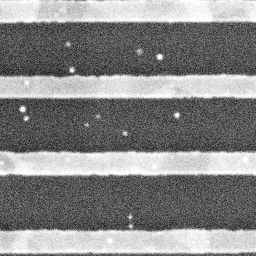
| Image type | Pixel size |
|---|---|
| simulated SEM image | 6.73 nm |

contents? lines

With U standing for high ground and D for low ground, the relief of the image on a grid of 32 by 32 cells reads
UUUUUUUUUUUUUUUUUUUUUUUUUUUUUUUU
UUUUUUUUUUUUUUUUUUUUUUUUUUUUUUUU
UUUUUUUUUUUUUUUUUDUUUUUDUUUUUDDU
DDDDDDDDDDDDDDDDDDDDDDDDDDDDDDDD
DDDDDDDDDDDDDDDDDDDDDDDDDDDDDDDD
DDDDDDDDDDDDDDDDDDDDDDDDDDDDDDDD
DDDDDDDDDDDDDDDDDDDDDDDDDDDDDDDD
DDDDDDDDDDDDDDDDDDDDDDDDDDDDDDDD
DDDDDDDDDDDDDDDDDDDDDDDDDDDDDDDD
DDDDDDDDDDDDDDDDDDDDDDDDDDDDUDDD
UUUUUUUUUUUUUUUUUUUUUUUUUUUUUUUU
UUUUUUUUUUUUUUUUUUUUUUUUUUUUUUUU
DDDDDDDDDDDDDDDDDDDDDDDDDDDDDDDD
DDDDDDDDDDDDDDDDDDDDDDDDDDDDDDDD
DDDDDDDDDDDDDDDDDDDDDDDDDDDDDDDD
DDDDDDDDDDDDDDDDDDDDDDDDDDDDDDDD
DDDDDDDDDDDDDDDDDDDDDDDDDDDDDDDD
DDDDDDDDDDDDDDDDDDDDDDDDDDDDDDDD
DDDDDDDDDDDDDDDDDDDDDDDDDDDDDDDD
UUUUUUUUUUUUUUUUUUUUUUUUUUUUUUUU
UUUUUUUUUUUUUUUUUUUUUUUUUUUUUUUU
UUUUUUUUUUUUUUUUUUUUUUUUUUUUUUUU
DDDDDDDDDDDDDDDDDDDDDDDDDDDDDDDD
DDDDDDDDDDDDDDDDDDDDDDDDDDDDDDDD
DDDDDDDDDDDDDDDDDDDDDDDDDDDDDDDD
DDDDDDDDDDDDDDDDDDDDDDDDDDDDDDDD
DDDDDDDDDDDDDDDDDDDDDDDDDDDDDDDD
DDDDDDDDDDDDDDDDDDDDDDDDDDDDDDDD
DDDDDDDDDDDDDDDDDDDDDDDDDDDDDDDD
UUUUUUUUUUUUUUUUUUUUUUUUUUUUUUUU
UUUUUUUUUUUUUUUUUUUUUUUUUUUUUUUU
UUUUUUUUDDDDDDDDUDDDUDDDDDDDDDDD